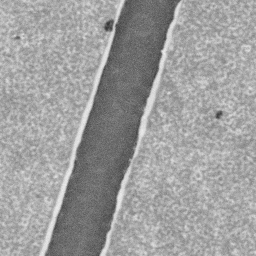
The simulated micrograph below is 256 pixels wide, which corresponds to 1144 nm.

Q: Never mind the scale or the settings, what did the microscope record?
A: one or a few lines or trenches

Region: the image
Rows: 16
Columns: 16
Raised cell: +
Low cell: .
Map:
++++++++...+++++
+++++++....+++++
+++++++....+++++
+++++++...++++++
++++++....++++++
++++++....++++++
++++++...+++++++
+++++....+++++++
+++++....+++++++
+++++....+++++++
++++....++++++++
++++....++++++++
++++...+++++++++
+++....+++++++++
+++....+++++++++
+++....+++++++++